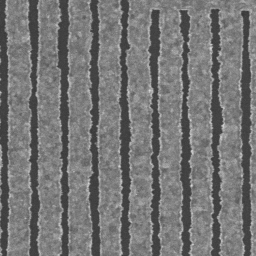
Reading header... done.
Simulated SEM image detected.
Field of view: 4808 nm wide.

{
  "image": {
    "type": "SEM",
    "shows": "parallel lines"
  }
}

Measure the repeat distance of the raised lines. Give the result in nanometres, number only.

570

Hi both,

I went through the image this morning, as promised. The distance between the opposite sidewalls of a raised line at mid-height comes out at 0.406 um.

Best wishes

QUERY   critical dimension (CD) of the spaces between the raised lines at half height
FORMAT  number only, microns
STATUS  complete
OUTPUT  0.156